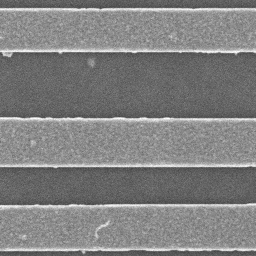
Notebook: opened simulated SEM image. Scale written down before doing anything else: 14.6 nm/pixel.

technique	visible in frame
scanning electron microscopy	lines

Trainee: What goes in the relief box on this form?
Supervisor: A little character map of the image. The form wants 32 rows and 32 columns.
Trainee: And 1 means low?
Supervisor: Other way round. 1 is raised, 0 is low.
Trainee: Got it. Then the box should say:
00000000000000000000000000000000
11111111111111111111111111111111
11111111111111111111111111111111
11111111111111111111111111111111
11111111111111111111111111111111
11111111111111111111111111111111
00000000000000000000000000001000
00000000000000000000000000000000
00000000000000000000000000000000
00000000000000000000000000000000
00000000000000000000000000000000
00000000000000000000000000000000
00000000000000000000000000000000
00000000000000000000000000000000
00000000000000000000000000000000
11111111111111111111111111111111
11111111111111111111111111111111
11111111111111111111111111111111
11111111111111111111111111111111
11111111111111111111111111111111
11111111111111111111111111111111
00000000000000000000000000000000
00000000000000000000000000000000
00000000000000000000000000000000
00000000000000000000000000000000
00000000000000000000000000000000
11111111111111111111111111111111
11111111111111111111111111111111
11111111111111111111111111111111
11111111111111111111111111111111
11111111111111111111111111111111
00000000000000000000000000000000